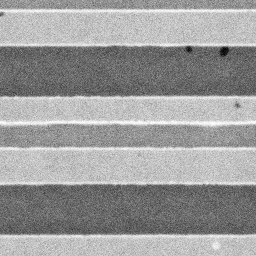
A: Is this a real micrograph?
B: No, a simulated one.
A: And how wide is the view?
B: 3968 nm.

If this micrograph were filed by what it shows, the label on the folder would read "lines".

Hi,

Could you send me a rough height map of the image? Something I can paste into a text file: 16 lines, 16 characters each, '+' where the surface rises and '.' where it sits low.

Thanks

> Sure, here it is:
++++++++++++++++
++++++++++++++++
++++++++++++++++
................
................
................
++++++++++++++++
++++++++++++++++
++++++++++++++++
++++++++++++++++
++++++++++++++++
................
................
................
................
++++++++++++++++